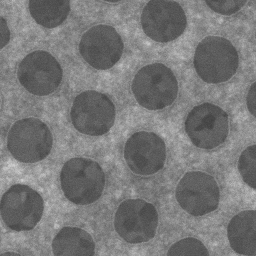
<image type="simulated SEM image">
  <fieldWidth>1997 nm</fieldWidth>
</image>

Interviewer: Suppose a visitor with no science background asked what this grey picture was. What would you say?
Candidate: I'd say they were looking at a regular array of raised bodies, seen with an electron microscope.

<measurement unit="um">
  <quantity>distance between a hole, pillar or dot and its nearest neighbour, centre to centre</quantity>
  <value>0.517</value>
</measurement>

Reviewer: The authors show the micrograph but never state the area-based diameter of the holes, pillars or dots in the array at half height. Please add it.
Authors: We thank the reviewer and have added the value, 368 nm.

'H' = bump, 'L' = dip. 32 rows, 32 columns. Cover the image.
LLLLHHHHHLLLLLLLLLHHHHLLLLHHHHHL
LLLLHHHHHLLLLLLLLLHHHHHLLLLHHHLL
HLLLHHHHLLLLLLLLLHHHHHHLLLLLLLLL
HLLLLLHLLLLHHHLLLLHHHHHLLLLLLLLL
HLLLLLLLLLHHHHHLLLHHHHHLLLHLLLLL
HLLLLLLLLLHHHHHHLLLLLLLLLHHHHLLL
LLLLHHLLLLHHHHHLLLLLLLLLHHHHHHLL
LLLHHHHLLLHHHHHLLLLLLLLLHHHHHHLL
LLHHHHHHLLLLHHLLLLHHHLLLHHHHHHLL
LLHHHHHHLLLLLLLLLHHHHHLLLHHHHLLL
LLLHHHHHLLLLLLLLHHHHHHLLLLHLLLLH
LLLHHHHLLLHHHLLLHHHHHHLLLLLLLLLH
LLLLLLLLLHHHHHLLLHHHHHLLLLLLLLLH
LLLLLLLLLHHHHHLLLLHHHLLLHHHHLLLH
LLLLLLLLLHHHHHHLLLLLLLLHHHHHHLLL
LLHHHHLLLHHHHHLLLLLLLLLHHHHHHLLL
LHHHHHLLLLHHHHLLLHHLLLLHHHHHHLLL
LHHHHHHLLLLLLLLLHHHHLLLLHHHHLLLL
LHHHHHHLLLLLLLLHHHHHHLLLLHHLLLLH
LHHHHHLLLLLLLLLHHHHHHLLLLLLLLLHH
LLLLLLLLHHHHLLLLHHHHHLLLLLLLLLHH
LLLLLLLLHHHHHLLLLHHHLLLHHHLLLLHH
LLLLLLLHHHHHHLLLLLLLLLHHHHHLLLHH
LHHHLLLLHHHHHLLLLLLLLLHHHHHLLLLH
HHHHHLLLHHHHHLLLLLLLLLHHHHHHLLLL
HHHHHHLLLHHLLLLHHHHLLLHHHHHLLLLL
HHHHHLLLLLLLLLHHHHHHLLLHHHHLLLHH
HHHHHLLLLLLLLLHHHHHHLLLLLLLLLHHH
LHHHLLLLHHLLLLHHHHHHLLLLLLLLHHHH
LLLLLLLHHHHHLLLHHHHLLLLLLLLLHHHH
LLLLLLHHHHHHLLLLHHLLLLHHHHLLLHHH
HHLLLLHHHHHHLLLLLLLLLHHHHHLLLHHH